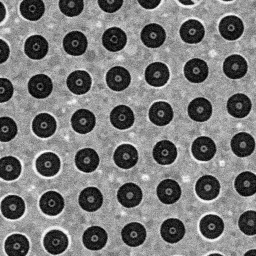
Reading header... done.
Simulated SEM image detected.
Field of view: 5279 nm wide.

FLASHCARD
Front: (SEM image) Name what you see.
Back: an array of small figures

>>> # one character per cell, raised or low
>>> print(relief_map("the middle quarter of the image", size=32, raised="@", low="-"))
@@@@@@@@@@@@@-@@@@@@@-----@@@@--
@@@--@@@@@@-----@@@@------@@@@--
@-----@@@@------@@@@-------@@@--
@------@@@---@---@@@-------@@@--
---@---@@@-------@@@------@@@@@-
@------@@@@-----@@@@@@---@@@@@@@
@------@@@@@---@@@@@@@@@@@@@@@@@
@@---@@@@@@@@@@@@@@@@@@@@@@@@@@@
@@@@@@@@@@@@@@@@@@@@@@@@@@@@@@@@
@@@@@@@@@@@@@@@@@@@@@@----@@@@@-
@@@@@@@@@@@@@---@@@@@@-----@@@@-
@@@---@@@@@@-----@@@@------@@@@-
@@------@@@------@@@@---@--@@@@-
@@------@@@---@---@@@------@@@@@
@---@---@@@-------@@@@-----@@@@@
@@------@@@@-----@@@@@@--@@@@@@@
@@-----@@@@@@@--@@@@@@@@@@@@@@@@
@@@@--@@@@@@@@@@@@@@@@@@@@@@@@@@
@@@@@@@@@@@@@@@@@@@@@@@@@@@@@@@@
@@@@@@@@@@@@@@@@@@@@@@@----@@@@@
@@@@@@@@@@@@@@----@@@@@-----@@@@
@@@@----@@@@@-----@@@@------@@@@
@@@------@@@-------@@@---@--@@@@
@@@------@@@---@---@@@------@@@@
@@---@---@@@------@@@@@-----@@@@
@@@------@@@@-----@@@@@@@-@@@@@@
@@@-----@@@@@@@-@@@@@@@@@@@@@@@@
@@@@@@@@@@@@@@@@@@@@@@@@@@@@@@@@
@@@@@@@@@@@@@@@@@@@@@@@@@@@@@@@@
@@@@@@@@@@@@@@@@-@@@@@@@----@@@@
@@@@@@-@@@@@@@-----@@@@------@@@
@@@@-----@@@@------@@@@------@@@